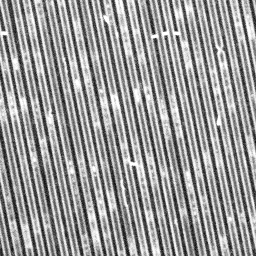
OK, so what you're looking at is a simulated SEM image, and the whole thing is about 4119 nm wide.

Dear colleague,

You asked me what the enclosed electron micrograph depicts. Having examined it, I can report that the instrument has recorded parallel lines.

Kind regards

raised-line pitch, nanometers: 182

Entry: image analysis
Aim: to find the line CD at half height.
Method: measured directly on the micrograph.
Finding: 96.7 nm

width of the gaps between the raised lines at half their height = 82.9 nm